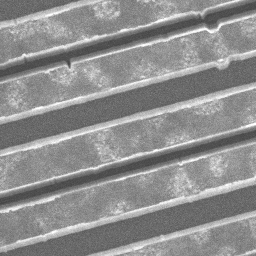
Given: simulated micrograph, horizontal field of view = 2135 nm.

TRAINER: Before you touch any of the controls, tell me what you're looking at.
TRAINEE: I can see one or a few lines or trenches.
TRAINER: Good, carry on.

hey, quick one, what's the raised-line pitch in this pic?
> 0.507 micrometres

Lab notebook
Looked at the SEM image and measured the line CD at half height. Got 0.33 µm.